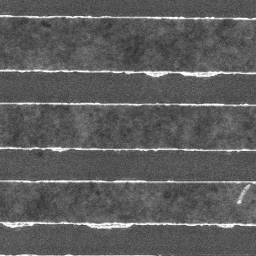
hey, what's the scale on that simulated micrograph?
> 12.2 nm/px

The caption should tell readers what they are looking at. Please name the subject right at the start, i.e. lines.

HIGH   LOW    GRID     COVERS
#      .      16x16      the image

................
################
################
################
.......#########
................
#######.........
################
################
................
................
################
################
################
................
................